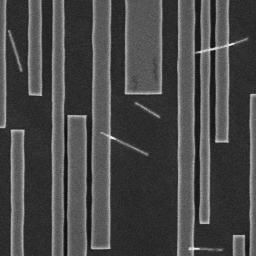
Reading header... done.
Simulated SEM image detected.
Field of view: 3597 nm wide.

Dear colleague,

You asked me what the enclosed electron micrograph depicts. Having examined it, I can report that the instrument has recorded groups of lines, slits or small figures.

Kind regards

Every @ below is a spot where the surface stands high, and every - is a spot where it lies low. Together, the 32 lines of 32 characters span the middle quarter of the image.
-------@@@@----@@@@@@@@@----@@@@
-------@@@@----@@@@@@@@@----@@@@
-------@@@@----@@@@@@@@@----@@@@
-------@@@@----@@@@@@@@@-----@@@
-------@@@@----@@@@@@@@@-----@@@
-------@@@@----@@@@@@@@@-----@@@
-------@@@@----@@@@@@@@@-----@@@
-------@@@@------------------@@@
-------@@@@------------------@@@
-------@@@@------------------@@@
-------@@@@------------------@@@
-------@@@@------------------@@@
-------@@@@------------------@@@
-@@@@@-@@@@------------------@@@
-@@@@--@@@@------------------@@@
-@@@@@-@@@@------------------@@@
-@@@@@-@@@@------------------@@@
-@@@@@-@@@@------------------@@@
-@@@@@-@@@@@-----------------@@@
-@@@@@-@@@@------------------@@@
-@@@@@-@@@@------------------@@@
-@@@@@-@@@@------------------@@@
-@@@@@-@@@@------------------@@@
-@@@@@-@@@@------------------@@@
-@@@@@-@@@@------------------@@@
-@@@@@-@@@@------------------@@@
-@@@@@-@@@@------------------@@@
-@@@@@-@@@@------------------@@@
-@@@@@-@@@@------------------@@@
-@@@@@-@@@@------------------@@@
-@@@@@-@@@@------------------@@@
-@@@@@-@@@@------------------@@@